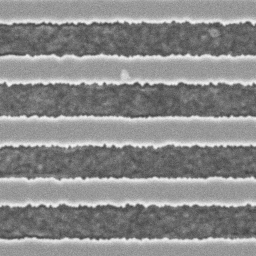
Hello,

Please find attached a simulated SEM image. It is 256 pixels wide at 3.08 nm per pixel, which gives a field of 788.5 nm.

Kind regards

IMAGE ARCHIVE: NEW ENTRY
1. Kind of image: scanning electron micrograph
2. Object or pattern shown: lines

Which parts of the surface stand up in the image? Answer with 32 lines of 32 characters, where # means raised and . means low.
################################
################################
################################
................................
................................
................................
................................
################################
################################
################################
.#.......#..#.#......#.###....##
................................
................................
.................#..............
....#.....#.............#.......
################################
################################
################################
................................
................................
................................
................................
################################
################################
################################
#################.##############
................................
................................
................................
................................
################################
################################